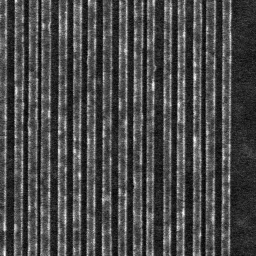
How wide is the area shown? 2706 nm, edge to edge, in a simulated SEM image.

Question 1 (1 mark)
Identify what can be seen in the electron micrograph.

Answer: parallel lines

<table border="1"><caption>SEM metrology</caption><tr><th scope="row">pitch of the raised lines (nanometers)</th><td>157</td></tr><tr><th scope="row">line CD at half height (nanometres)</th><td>80.6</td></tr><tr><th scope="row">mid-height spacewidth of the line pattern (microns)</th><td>0.0766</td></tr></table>